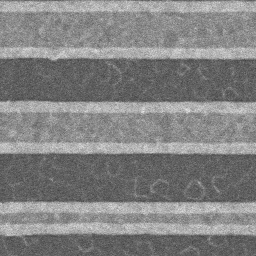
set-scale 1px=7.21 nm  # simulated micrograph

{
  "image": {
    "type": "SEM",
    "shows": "one or a few lines or trenches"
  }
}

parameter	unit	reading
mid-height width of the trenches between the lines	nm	419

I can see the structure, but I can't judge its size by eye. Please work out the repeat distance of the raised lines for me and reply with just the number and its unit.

0.68 micrometres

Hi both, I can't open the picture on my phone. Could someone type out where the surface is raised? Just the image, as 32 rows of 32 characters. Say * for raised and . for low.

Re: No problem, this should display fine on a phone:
................................
********************************
********************************
********************************
********************************
********************************
......**..........**************
................................
................................
................................
................................
................................
................................
****............................
********************************
********************************
********************************
********************************
................................
................................
................................
................................
................................
................................
................................
................................
********************************
********************************
*******......****....***********
................................
................................
................................